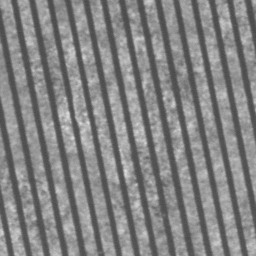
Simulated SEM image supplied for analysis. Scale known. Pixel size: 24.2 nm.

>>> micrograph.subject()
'parallel lines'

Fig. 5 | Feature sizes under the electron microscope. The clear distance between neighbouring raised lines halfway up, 6.99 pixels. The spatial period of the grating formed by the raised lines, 428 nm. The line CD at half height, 259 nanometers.